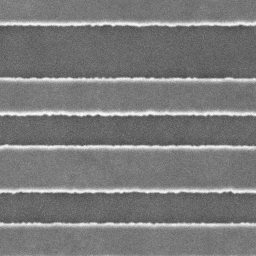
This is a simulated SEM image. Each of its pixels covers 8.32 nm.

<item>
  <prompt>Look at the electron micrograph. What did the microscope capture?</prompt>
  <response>lines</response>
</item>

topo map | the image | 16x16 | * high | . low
****************
****************
................
................
................
****************
****************
................
................
****************
****************
****************
................
................
****************
****************